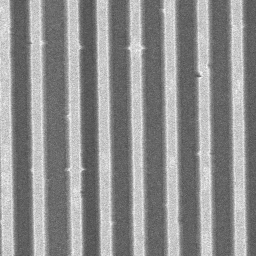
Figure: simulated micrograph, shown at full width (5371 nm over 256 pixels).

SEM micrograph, parallel lines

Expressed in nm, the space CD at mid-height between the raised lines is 406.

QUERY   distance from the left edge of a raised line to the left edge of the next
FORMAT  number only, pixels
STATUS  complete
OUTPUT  33.5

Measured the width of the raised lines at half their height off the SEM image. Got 294 nm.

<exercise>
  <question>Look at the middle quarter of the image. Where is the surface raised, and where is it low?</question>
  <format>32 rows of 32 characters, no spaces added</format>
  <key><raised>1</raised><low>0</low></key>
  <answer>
01110000111000001111000001110000
01110000111000000111000001110000
01110000111000000111000001110000
01110000111000000111000001110000
01110000111000000111000001110000
01110000111100000111000001110000
01110000111100000111000001110000
01110000111100000111000001110000
01110000111100000111000001110000
01110000111100000111000001110000
01110000111100000111000001110000
01110000111100000111000001110000
01110000111100000111000001110000
01110000111100000111000001111000
01110000111100000111000001111000
01110000111100000111000001111000
01110000111100000111000001111000
01110000111100000111000001111000
01110000111100000111000001111000
01110000111100000111000001111000
01111000111100000111000001111000
01111000111100000111000001110000
01111000011100000111000001110000
01111000011100000111000001110000
01111000011100000111000001110000
01111000011100000111000001110000
01111000011100000111000001111000
01110000011100000111000001111000
01110000011100000111000001111000
01110000011100000111000000111000
01110000011100000111000000111000
01110000011100000111000000111000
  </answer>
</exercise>